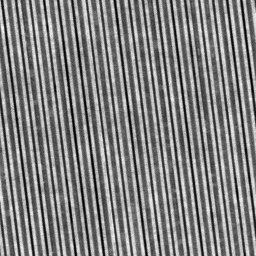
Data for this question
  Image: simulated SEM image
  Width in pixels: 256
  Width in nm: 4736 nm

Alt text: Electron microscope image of parallel lines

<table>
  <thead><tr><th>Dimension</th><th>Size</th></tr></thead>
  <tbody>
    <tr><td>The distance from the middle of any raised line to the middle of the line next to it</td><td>129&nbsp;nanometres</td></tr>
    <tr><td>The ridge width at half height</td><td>55.1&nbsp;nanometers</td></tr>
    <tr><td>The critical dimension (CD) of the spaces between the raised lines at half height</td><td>0.0895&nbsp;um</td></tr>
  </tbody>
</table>